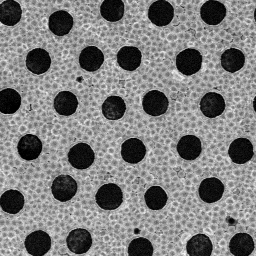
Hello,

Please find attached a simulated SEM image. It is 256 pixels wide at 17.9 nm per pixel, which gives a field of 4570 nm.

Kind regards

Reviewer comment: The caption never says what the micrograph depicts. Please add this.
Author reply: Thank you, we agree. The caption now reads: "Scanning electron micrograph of a regular array of holes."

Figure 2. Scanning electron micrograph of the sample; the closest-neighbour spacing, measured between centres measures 808 nm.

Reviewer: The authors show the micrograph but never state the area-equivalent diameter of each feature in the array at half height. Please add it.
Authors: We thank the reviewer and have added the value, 465 nm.